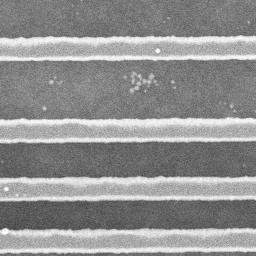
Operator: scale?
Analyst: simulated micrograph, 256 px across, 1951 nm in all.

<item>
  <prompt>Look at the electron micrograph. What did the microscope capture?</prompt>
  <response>lines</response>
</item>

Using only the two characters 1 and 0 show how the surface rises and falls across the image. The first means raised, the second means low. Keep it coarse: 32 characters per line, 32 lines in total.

00000000000000000000000000000000
00000000000000000000000000000000
00000000000000000000000000000000
00000000000000000000000000000000
00000000000000000000000000000000
11111111111111111111111111111111
11111111111111111111111111111111
01111000011000000000000000000000
00000000000000000000000000000000
00000000000000000000000000000000
00000000000000000000000000000000
00000000000000000000000000000000
00000000000000000000000000000000
00000000000000000000000000000000
00000000000000000000000000000000
11111111111111111111111111111111
11111111111111111111111111111111
11111111111111111111111111111111
00000000000000000000000000000000
00000000000000000000000000000000
00000000000000000000000000000000
00000000000000000000000000000000
11111111111111111111111111111111
11111111111111111111111111111111
11111111111111111111111111111111
00000000000000000000000000000000
00000000000000000000000000000000
00000000000000000000000000000000
00000000000000000000000000000000
11111111111111111111111111111111
11111111111111111111111111111111
10000000000000000000000000000000